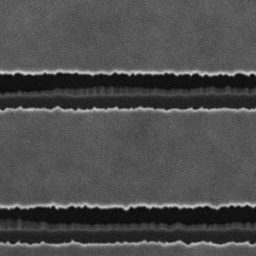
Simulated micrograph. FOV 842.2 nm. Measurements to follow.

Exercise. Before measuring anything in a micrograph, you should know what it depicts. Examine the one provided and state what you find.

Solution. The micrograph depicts lines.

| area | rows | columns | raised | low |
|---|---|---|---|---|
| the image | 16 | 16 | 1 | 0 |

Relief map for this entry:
1111111111111111
1111111111111111
1111111111111111
1111111111111111
1111111111111111
0000000000000000
0000000000000000
1111111111111111
1111111111111111
1111111111111111
1111111111111111
1111111111111111
1111111111111111
0000000000000000
0000000000000000
1111111111111111